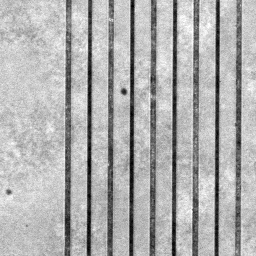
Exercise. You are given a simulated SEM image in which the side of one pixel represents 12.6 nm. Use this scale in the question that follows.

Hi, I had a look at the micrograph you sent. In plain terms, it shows parallel lines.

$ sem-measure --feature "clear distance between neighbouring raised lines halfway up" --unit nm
77.1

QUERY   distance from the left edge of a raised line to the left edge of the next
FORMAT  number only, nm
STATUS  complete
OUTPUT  266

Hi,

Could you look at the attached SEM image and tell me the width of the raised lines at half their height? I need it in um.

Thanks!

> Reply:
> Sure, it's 0.201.